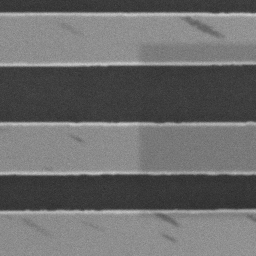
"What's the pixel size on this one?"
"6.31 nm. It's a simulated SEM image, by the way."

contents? lines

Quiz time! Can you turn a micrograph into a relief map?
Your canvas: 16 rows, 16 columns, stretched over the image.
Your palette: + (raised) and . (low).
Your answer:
................
++++++++++++++++
++++++++++++++++
++++++++++++++++
................
................
................
................
++++++++++++++++
++++++++++++++++
++++++++++++++++
................
................
++++++++++++++++
++++++++++++++++
++++++++++++++++